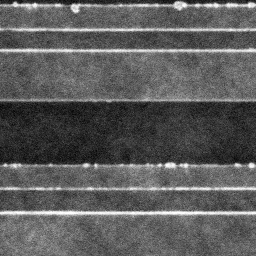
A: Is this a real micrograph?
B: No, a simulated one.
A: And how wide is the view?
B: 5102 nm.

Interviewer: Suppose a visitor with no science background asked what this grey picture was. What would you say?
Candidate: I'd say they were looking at lines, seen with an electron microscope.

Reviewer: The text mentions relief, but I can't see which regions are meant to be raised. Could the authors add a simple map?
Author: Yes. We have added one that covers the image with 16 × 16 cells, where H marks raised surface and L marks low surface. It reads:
HHHHHHHHHHHHHHHH
HHHHHHHHHHHHHHHH
HHHHHHHHHHHHHHHH
HHHHHHHHHHHHHHHH
HHHHHHHHHHHHHHHH
HHHHHHHHHHHHHHHH
LLLLLLLLLLLLLLLL
LLLLLLLLLLLLLLLL
LLLLLLLLLLLLLLLL
LLLLLLLLLLLLLLLL
HHHHHHHHHHHHHHHH
HHHHHHHHHHHHHHHH
HHHHHHHHHHHHHHHH
HHHHHHHHHHHHHHHH
HHHHHHHHHHHHHHHH
HHHHHHHHHHHHHHHH